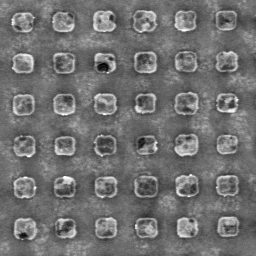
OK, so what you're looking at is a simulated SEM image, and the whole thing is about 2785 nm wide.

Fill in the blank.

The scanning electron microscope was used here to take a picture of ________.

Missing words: a regular array of raised bodies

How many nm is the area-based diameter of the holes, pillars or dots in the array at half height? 228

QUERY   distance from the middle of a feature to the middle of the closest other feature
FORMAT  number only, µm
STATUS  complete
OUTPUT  0.441